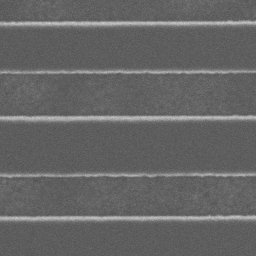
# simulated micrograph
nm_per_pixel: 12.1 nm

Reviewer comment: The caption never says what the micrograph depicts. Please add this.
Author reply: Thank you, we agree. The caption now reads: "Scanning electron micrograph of lines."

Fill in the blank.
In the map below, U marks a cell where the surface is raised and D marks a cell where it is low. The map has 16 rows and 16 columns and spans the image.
DDDDDDDDDDDDDDDD
UUUUUUUUUUUUUUUU
UUUUUUUUUUUUUUUU
UUUUUUUUUUUUUUUU
UUUUUUUUUUUUUUUD
DDDDDDDDDDDDDDDD
DDDDDDDDDDDDDDDD
UUUUUUUUUUUUUUUU
UUUUUUUUUUUUUUUU
UUUUUUUUUUUUUUUU
UUUUUUUUUUUUUUUU
DDDDDDDDDDDDDDDD
DDDDDDDDDDDDDDDD
DDDDDDDDDDDDDDDD
UUUUUUUUUUUUUUUU
UUUUUUUUUUUUUUUU